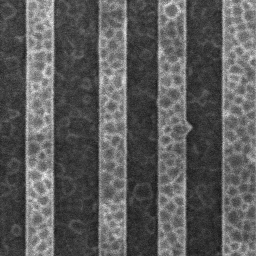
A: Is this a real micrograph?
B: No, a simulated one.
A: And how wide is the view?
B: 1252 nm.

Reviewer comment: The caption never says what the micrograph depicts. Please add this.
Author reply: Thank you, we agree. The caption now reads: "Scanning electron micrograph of one or a few lines or trenches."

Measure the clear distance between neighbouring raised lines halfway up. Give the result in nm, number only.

186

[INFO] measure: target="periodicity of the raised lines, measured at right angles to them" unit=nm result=322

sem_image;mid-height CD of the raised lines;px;25.8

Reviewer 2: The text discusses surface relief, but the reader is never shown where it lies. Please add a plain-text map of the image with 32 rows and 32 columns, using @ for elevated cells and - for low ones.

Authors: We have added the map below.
---@@@@------@@@----@@@-----@@@@
---@@@@------@@@----@@@-----@@@@
----@@@------@@@----@@@-----@@@@
----@@@------@@@----@@@-----@@@@
----@@@------@@@----@@@-----@@@@
----@@@-----@@@@----@@@-----@@@@
----@@@-----@@@@----@@@-----@@@@
----@@@------@@@----@@@-----@@@@
----@@@------@@@----@@@-----@@@@
----@@@------@@@----@@@-----@@@@
----@@@------@@@----@@@-----@@@@
----@@@------@@@----@@@-----@@@@
----@@@------@@@----@@@-----@@@@
----@@@------@@@----@@@-----@@@@
---@@@@------@@@----@@@-----@@@@
---@@@@------@@@----@@@@----@@@@
---@@@@------@@@----@@@-----@@@@
---@@@@------@@@----@@@-----@@@@
---@@@@------@@@----@@@-----@@@@
---@@@@------@@@----@@@-----@@@@
---@@@@------@@@----@@@-----@@@@
---@@@@------@@@----@@@-----@@@@
---@@@@------@@@----@@@-----@@@@
---@@@@------@@@----@@@-----@@@@
---@@@@------@@@----@@@-----@@@@
---@@@@------@@@----@@@-----@@@@
---@@@@------@@@----@@@-----@@@@
---@@@-------@@@----@@@-----@@@@
---@@@-------@@@----@@@-----@@@@
---@@@-------@@@----@@@-----@@@@
---@@@-------@@@----@@@-----@@@@
---@@@-------@@@----@@@-----@@@@